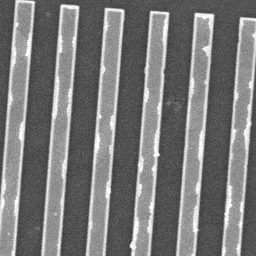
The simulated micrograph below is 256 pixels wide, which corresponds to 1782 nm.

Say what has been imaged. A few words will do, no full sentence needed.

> parallel lines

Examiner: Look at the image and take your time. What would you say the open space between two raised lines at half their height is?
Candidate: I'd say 0.2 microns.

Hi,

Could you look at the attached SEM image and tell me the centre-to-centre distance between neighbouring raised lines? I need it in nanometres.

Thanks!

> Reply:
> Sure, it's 312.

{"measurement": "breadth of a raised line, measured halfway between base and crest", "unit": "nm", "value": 115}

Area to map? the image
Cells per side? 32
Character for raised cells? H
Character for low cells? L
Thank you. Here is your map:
LLHHLLLLLLLLLLLLLLLLLLLLLLLLLLLL
LLHHLLLLHHLLLHHLLLLLLLLLLLLLLLLL
LLHHLLLLHHLLLHHLLLLHHLLLHHHLLLHH
LLHHLLLLHLLLLHHLLLLHHLLLHHLLLLHH
LLHHLLLHHLLLLHHLLLLHHLLLHHLLLLHH
LLHHLLLHHLLLLHHLLLLHHLLLHHLLLLHH
LLHHLLLHHLLLLHHLLLLHLLLLHHLLLLHH
LLHHLLLHHLLLLHHLLLLHHLLLHHLLLLHH
LHHLLLLHHLLLLHHLLLHHLLLLHHLLLLHH
LHHLLLLHHLLLLHHLLLHHLLLLHHLLLLHH
LHHLLLLHHLLLLHHLLLHHLLLLHHLLLLHL
LHHLLLLHHLLLHHHLLLHHLLLLHHLLLHHL
LHHLLLLHHLLLHHLLLLHHLLLLHHLLLHHL
LHHLLLLHHLLLHHLLLLHHLLLLHHLLLHHL
LHHLLLLHHLLLHHLLLLHHLLLLHHLLLHHL
LHHLLLLHHLLLHHLLLLHHLLLHHLLLLHHL
LHHLLLLHLLLLHHLLLLHHLLLHHLLLLHHL
LHHLLLHHLLLLHHLLLLHHLLLHHLLLLHHL
LHHLLLHHLLLLHHLLLLHHLLLHHLLLLHHL
LHHLLLHHLLLLHHLLLLHHLLLHHLLLLHHL
LHHLLLHHLLLLHHLLLHHLLLLHHLLLLHHL
LHLLLLHHLLLLHHLLLHHLLLLHHLLLLHHL
HHLLLLHHLLLLHHLLLHHLLLLHHLLLLHHL
HHLLLLHHLLLLHHLLLHHLLLLHHLLLLHLL
HHLLLLHHLLLHHHLLLHHLLLLHHLLLHHLL
HHLLLLHHLLLHHLLLLHHLLLLHHLLLHHLL
HHLLLLHHLLLHHLLLLHHLLLLHHLLLHHLL
HHLLLLHHLLLHHLLLLHHLLLLHHLLLHHLL
HHLLLLHHLLLHHLLLLHHLLLHHHLLLHHLL
HHLLLLHLLLLHHLLLLHHLLLHHLLLLHHLL
HHLLLHHLLLLHHLLLHHHLLLHHLLLLHHLL
HHLLLHHLLLLHHLLLLHHLLLHHLLLLHHLL